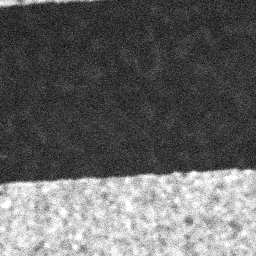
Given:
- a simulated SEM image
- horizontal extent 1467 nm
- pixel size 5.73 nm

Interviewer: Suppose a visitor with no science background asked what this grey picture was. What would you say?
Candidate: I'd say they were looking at one or a few lines or trenches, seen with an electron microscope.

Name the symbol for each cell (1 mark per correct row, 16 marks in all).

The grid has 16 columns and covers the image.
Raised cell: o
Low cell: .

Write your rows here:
................
................
................
................
................
................
................
................
................
................
................
.ooooooooooooooo
oooooooooooooooo
oooooooooooooooo
oooooooooooooooo
oooooooooooooooo